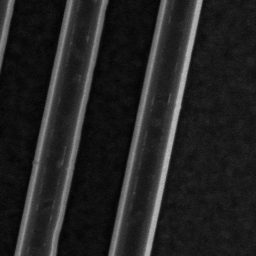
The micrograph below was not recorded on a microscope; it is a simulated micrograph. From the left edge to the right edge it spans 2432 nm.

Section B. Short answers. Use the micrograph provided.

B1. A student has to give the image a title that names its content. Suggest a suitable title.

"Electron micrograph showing one or a few lines or trenches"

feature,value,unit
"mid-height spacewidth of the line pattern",541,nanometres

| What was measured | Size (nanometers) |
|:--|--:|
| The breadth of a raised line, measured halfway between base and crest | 334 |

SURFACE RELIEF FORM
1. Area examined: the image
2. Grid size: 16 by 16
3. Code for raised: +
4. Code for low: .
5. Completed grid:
+...++....++....
....++....++....
....++....++....
....++...+++....
...+++...+++....
...++....++.....
...++....++.....
...++....++.....
...++...+++.....
..+++...++......
..++....++......
..++....++......
..++....++......
..++...+++......
.+++...++.......
.++....++.......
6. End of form